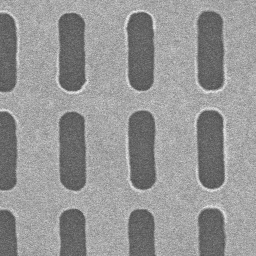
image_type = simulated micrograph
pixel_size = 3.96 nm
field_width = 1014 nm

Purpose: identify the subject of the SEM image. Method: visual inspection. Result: holes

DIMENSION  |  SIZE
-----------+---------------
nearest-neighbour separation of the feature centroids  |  68.7 px